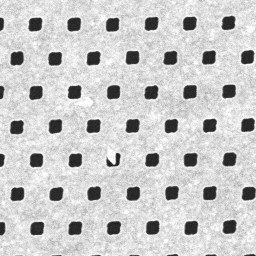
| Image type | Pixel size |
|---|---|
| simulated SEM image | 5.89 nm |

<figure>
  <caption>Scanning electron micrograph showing a regular array of holes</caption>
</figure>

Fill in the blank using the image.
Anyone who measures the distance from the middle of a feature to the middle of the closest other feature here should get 226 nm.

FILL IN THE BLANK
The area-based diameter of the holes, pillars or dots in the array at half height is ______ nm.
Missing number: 86.9